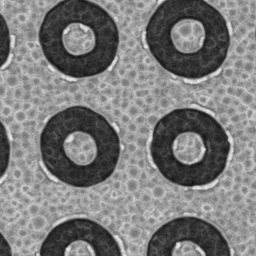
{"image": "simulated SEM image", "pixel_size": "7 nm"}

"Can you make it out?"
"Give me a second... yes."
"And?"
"ring-shaped grooves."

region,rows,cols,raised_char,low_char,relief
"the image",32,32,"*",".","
*******.....********......******
******.......******........*****
.****.........*****....*....****
.****...***....***....***....***
.****...****...***...*****...***
.****...****...***....***....***
.****....**....****....*....****
.*****........******........****
*******......*******.......*****
********....**********....******
********************************
********************************
********************************
********...*********************
*******......*******......******
******........*****........*****
.****....*.....****.........****
.****...****...****...***....***
.****...****...****...****...***
.****...****...****...***...****
.*****....*....****.........****
.*****........******........****
*******......********......*****
**********.*********************
********************************
********************************
********************************
*********..**********....*******
*******......*******.......*****
******........*****.........****
.****....**....***....**.....***
.****...****...***....***....***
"